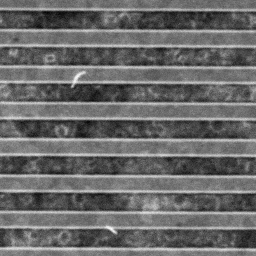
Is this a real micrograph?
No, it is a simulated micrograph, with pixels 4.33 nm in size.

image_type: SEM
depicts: parallel lines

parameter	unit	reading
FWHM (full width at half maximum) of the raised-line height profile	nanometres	68.2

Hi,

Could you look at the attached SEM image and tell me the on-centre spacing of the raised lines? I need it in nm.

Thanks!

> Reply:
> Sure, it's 157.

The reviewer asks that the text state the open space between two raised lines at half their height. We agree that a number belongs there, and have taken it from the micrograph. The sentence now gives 90.9 nm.